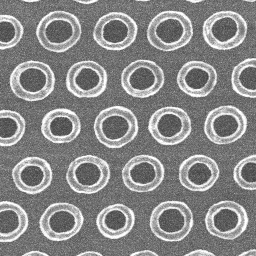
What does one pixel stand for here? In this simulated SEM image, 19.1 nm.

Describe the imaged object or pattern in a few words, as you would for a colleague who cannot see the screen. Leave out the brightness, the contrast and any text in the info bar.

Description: a regular array of ring-shaped raised bodies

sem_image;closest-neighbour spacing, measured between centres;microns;1.04